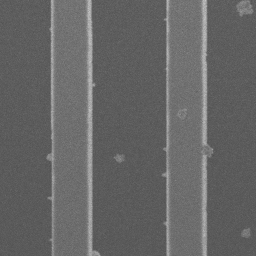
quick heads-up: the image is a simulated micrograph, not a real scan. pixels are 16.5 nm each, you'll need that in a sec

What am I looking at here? lines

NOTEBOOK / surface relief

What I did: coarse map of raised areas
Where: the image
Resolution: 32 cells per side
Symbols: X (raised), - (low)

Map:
------XXXXX----------XXXXX------
------XXXXX----------XXXXX------
------XXXXX----------XXXXX------
------XXXXX----------XXXXX------
------XXXXX----------XXXXX------
------XXXXX----------XXXXX------
------XXXXX----------XXXXX------
------XXXXX----------XXXXX------
------XXXXX----------XXXXX------
------XXXXX----------XXXXX------
------XXXXX----------XXXXX------
------XXXXX----------XXXXX------
------XXXXX----------XXXXX------
------XXXXX----------XXXXX------
------XXXXX----------XXXXX------
-------XXXX----------XXXXX------
-------XXXX----------XXXXX------
-------XXXX----------XXXXX------
-------XXXX----------XXXXX------
-------XXXX----------XXXXX------
-------XXXX----------XXXXX------
-------XXXX----------XXXXX------
-------XXXX----------XXXXX------
-------XXXX----------XXXXX------
-------XXXX----------XXXXX------
-------XXXX----------XXXXX------
-------XXXX----------XXXXX------
-------XXXX----------XXXXX------
-------XXXX----------XXXXX------
-------XXXX----------XXXXX------
-------XXXX----------XXXXX------
-------XXXX----------XXXXX------